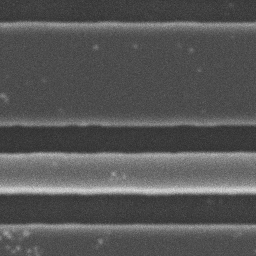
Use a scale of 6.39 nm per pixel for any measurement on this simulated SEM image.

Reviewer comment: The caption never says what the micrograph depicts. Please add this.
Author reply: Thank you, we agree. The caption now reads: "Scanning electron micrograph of lines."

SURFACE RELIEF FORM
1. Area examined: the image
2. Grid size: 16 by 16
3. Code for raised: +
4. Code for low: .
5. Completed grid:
................
++++++++++++++.+
++++++++++++++++
++++++++++++++++
++++++++++++++++
++++++++++++++++
++++++++++++++++
++++++++++++++++
................
................
++++++++++++++++
++++++++++++++++
................
................
++++++++++++++++
++++++++++++++++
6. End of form